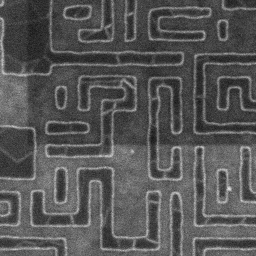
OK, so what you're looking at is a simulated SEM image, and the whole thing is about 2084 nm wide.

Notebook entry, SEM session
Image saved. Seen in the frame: wiring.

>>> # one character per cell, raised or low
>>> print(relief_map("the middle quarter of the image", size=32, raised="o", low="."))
................................
................................
................................
....oooooooooooooo....ooooooo...
....oooooooooooooo...oooooooo...
....oooooooooooooo...ooo.oooo...
o...oo.........ooo...oo....oo...
o...oo.........ooo...ooo...oo...
o...oo.........ooo...ooo...oo...
....oo...ooooooooo...ooo...oo...
....oo...ooooooooo...ooo...oo...
....oo...ooooooooo...ooo...oo...
.........ooo.........oo....oo...
.........ooo.........oo....oo...
.........ooo.........oo....oo...
oooooo...ooo.........oo....oo...
oooooo...ooo.........oo....oo...
.........ooo.........oo.........
.........ooo.........oo.........
.........ooo.........oo.........
oooooooooooo.........oo.........
oooooooooooo.........oo....oo...
oooooooooooo.........oo....oo...
.....................oo....oo...
.....................oo....oo...
.....................oo....oo...
o...oooooooo.........ooo..ooo...
o..ooooooooo.........oooooooo...
o..ooooooooo..........ooooooo...
o..oooo..ooo....................
o..ooo...ooo....................
o..ooo...ooo....................